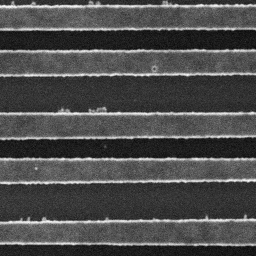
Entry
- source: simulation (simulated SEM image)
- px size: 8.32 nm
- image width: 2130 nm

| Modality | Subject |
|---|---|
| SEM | lines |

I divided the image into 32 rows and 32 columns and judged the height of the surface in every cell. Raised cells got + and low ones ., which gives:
................................
++++++++++++++++++++++++++++++++
++++++++++++++++++++++++++++++++
++++++++++++++++++++++++++++++++
................................
................................
++++++++++++++++++++++++++++++++
++++++++++++++++++++++++++++++++
++++++++++++++++++++++++++++++++
................................
................................
................................
................................
................................
++++++++++++++++++++++++++++++++
++++++++++++++++++++++++++++++++
++++++++++++++++++++++++++++++++
................................
................................
................................
++++++++++++++++++++++++++++++++
++++++++++++++++++++++++++++++++
++++++++++++++++++++++++++++++++
................................
................................
................................
................................
.................+.++..+++++++++
++++++++++++++++++++++++++++++++
++++++++++++++++++++++++++++++++
.........+.+..++++++++++++++++++
................................